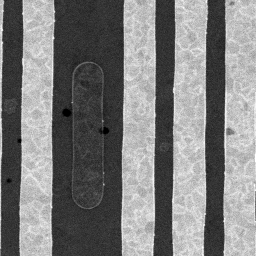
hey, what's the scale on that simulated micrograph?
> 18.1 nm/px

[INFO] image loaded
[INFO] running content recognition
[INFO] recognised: groups of lines, slits or small figures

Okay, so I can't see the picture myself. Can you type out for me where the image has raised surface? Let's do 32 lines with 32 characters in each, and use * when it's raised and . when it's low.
...****.........***...****..****
...****.........***...****..****
...****.........***...****..****
...****.........***...****..****
...****.........***...****..****
...****.........***...****..****
...****.........***...****..****
...****.........***...****..****
...***....***...***...****..****
...***...****...***...****..****
...***...****...***...****..****
...***...****...***...****..****
...***...****...***...****..****
...***...****...***...****..****
...***...****...***...****..****
...***...****...***...****..****
...***...****...***...***...****
...***...****..****...***...****
...***...****..****...****..****
...***...****..****...****..****
...***...****..****...****..****
...***...****..****...****..****
...***...****..****...****..****
...***...****..****...****..****
...***...****..****...****..****
...***....**...****...****..****
...***.........****...****..****
...***.........****...****..****
...***.........****...***...****
..****.........****...***...****
..****.........****...***...****
...***.........****...***...****